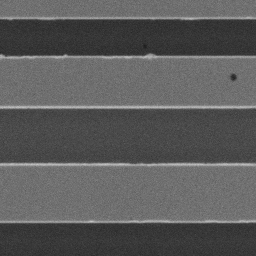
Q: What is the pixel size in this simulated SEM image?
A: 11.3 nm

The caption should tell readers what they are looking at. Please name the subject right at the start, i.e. lines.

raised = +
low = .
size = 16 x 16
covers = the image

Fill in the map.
++++++++++++++++
................
................
....+....+......
++++++++++++++++
++++++++++++++++
++++++++++++++++
................
................
................
++++++++++++++++
++++++++++++++++
++++++++++++++++
++++++++++++++++
................
................